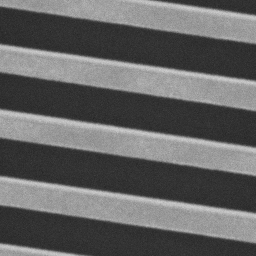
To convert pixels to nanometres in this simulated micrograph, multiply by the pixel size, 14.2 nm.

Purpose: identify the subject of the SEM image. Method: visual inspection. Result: lines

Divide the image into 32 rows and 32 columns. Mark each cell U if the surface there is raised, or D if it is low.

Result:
UUUUUUUUUUUUUUUUUUUUUUDDDDDDDDDD
DDDDDUUUUUUUUUUUUUUUUUUUUUUUUDDD
DDDDDDDDDDDDUUUUUUUUUUUUUUUUUUUU
DDDDDDDDDDDDDDDDDDUUUUUUUUUUUUUU
DDDDDDDDDDDDDDDDDDDDDDDDDUUUUUUU
DDDDDDDDDDDDDDDDDDDDDDDDDDDDDDDD
UUUUUUUDDDDDDDDDDDDDDDDDDDDDDDDD
UUUUUUUUUUUUUDDDDDDDDDDDDDDDDDDD
UUUUUUUUUUUUUUUUUUUUDDDDDDDDDDDD
DDDUUUUUUUUUUUUUUUUUUUUUUUUDDDDD
DDDDDDDDDDUUUUUUUUUUUUUUUUUUUUUU
DDDDDDDDDDDDDDDDUUUUUUUUUUUUUUUU
DDDDDDDDDDDDDDDDDDDDDDDUUUUUUUUU
DDDDDDDDDDDDDDDDDDDDDDDDDDDDDDUU
UUUUUDDDDDDDDDDDDDDDDDDDDDDDDDDD
UUUUUUUUUUUUDDDDDDDDDDDDDDDDDDDD
UUUUUUUUUUUUUUUUUUDDDDDDDDDDDDDD
DDUUUUUUUUUUUUUUUUUUUUUUUDDDDDDD
DDDDDDDDDUUUUUUUUUUUUUUUUUUUUUUU
DDDDDDDDDDDDDDDUUUUUUUUUUUUUUUUU
DDDDDDDDDDDDDDDDDDDDDDUUUUUUUUUU
DDDDDDDDDDDDDDDDDDDDDDDDDDDDDUUU
UUUDDDDDDDDDDDDDDDDDDDDDDDDDDDDD
UUUUUUUUUDDDDDDDDDDDDDDDDDDDDDDD
UUUUUUUUUUUUUUUUUDDDDDDDDDDDDDDD
UUUUUUUUUUUUUUUUUUUUUUUUDDDDDDDD
DDDDDDUUUUUUUUUUUUUUUUUUUUUUUUUD
DDDDDDDDDDDDDUUUUUUUUUUUUUUUUUUU
DDDDDDDDDDDDDDDDDDDDUUUUUUUUUUUU
DDDDDDDDDDDDDDDDDDDDDDDDDDUUUUUU
DDDDDDDDDDDDDDDDDDDDDDDDDDDDDDDD
UUUUUUUDDDDDDDDDDDDDDDDDDDDDDDDD